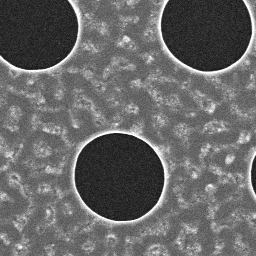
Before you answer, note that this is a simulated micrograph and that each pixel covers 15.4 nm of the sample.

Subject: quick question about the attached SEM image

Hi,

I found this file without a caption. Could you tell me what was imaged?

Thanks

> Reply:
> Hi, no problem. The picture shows holes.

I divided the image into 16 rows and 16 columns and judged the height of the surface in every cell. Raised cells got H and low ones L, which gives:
LLLLLHHHHHLLLLLH
LLLLLHHHHHLLLLLL
LLLLLHHHHHLLLLLL
LLLLHHHHHHHLLLLH
HHHHHHHHHHHHHHHH
HHHHHHHHHHHHHHHH
HHHHHHHHHHHHHHHH
HHHHHHHHHHHHHHHH
HHHHHHLLHHHHHHHH
HHHHHLLLLLHHHHHH
HHHHHLLLLLHHHHHH
HHHHHLLLLLHHHHHH
HHHHHLLLLLHHHHHH
HHHHHHLLLHHHHHHH
HHHHHHHHHHHHHHHH
HHHHHHHHHHHHHHHH